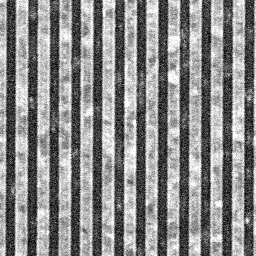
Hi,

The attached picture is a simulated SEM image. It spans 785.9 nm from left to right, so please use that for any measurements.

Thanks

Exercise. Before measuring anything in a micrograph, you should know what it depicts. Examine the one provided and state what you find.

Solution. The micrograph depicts parallel lines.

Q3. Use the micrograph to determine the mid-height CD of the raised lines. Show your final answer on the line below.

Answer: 33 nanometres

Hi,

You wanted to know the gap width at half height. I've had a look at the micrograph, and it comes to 36.1 nm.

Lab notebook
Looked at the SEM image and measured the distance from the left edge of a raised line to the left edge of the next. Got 66.6 nm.